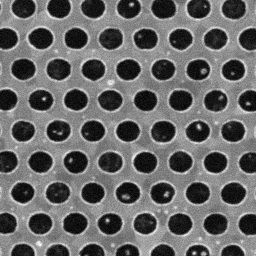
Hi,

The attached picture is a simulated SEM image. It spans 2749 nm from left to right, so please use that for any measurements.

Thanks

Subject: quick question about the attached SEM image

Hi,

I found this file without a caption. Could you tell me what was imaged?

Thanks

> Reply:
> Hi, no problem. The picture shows a regular array of holes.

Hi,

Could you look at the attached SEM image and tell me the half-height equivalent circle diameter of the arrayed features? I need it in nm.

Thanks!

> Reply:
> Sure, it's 256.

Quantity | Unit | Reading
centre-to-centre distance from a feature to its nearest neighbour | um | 0.374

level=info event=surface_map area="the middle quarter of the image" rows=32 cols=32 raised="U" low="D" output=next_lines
DDUUDDDDDDUUUDDDDDDUUUDDDDDDUUUD
DDUUDDDDDDUUUDDDDDDUUUDDDDDDUUDD
DDUUDDDDDDUUUDDDDDDUUUDDDDDDUUUD
DUUUUDDDDUUUUUDDDDUUUUUDDDDUUUUD
UUUUUUUUUUUUUUUUUUUUUUUUUUUUUUUU
UUUUUUUUUUUUUUUUUUUUUUUUUUUUUUUU
UUDDUUUUUUDDDUUUUUUDDUUUUUUUDDUU
DDDDDDUUUDDDDDUUUUDDDDDUUUUDDDDD
DDDDDDUUDDDDDDDUUDDDDDDDUUDDDDDD
DDDDDDUUDDDDDDDUUDDDDDDDUUDDDDDD
DDDDDDUUUDDDDDUUUUDDDDDUUUDDDDDD
UUDDDUUUUUDDDUUUUUUDDDUUUUUUDDDU
UUUUUUUUUUUUUUUUUUUUUUUUUUUUUUUU
UUUUUUUUUUUUUUUUUUUUUUUUUUUUUUUU
DUUUUDDDDUUUUUDDDDUUUUUDDDDUUUUU
DDUUDDDDDDUUUDDDDDDUUUDDDDDDUUUD
DDUUDDDDDDUUUDDDDDDUUUDDDDDDUUDD
DDUUDDDDDDUUUDDDDDDUUUDDDDDDUUDD
DUUUUDDDDDUUUUDDDDUUUUDDDDDDUUUD
UUUUUUUDUUUUUUUDDUUUUUUDDDUUUUUU
UUUUUUUUUUUUUUUUUUUUUUUUUUUUUUUU
UUUUUUUUUUUUUUUUUUUUUUUUUUUUUUUU
UDDDDUUUUUDDDDUUUUDDDDUUUUUDDDDU
DDDDDDUUUDDDDDDUUDDDDDDUUUDDDDDD
DDDDDDUUDDDDDDDUUDDDDDDUUUDDDDDD
DDDDDDUUUDDDDDDUUDDDDDDUUUDDDDDD
UDDDDUUUUDDDDDUUUUDDDDDUUUUDDDDU
UUUUUUUUUUUDUUUUUUUUDUUUUUUUUUUU
UUUUUUUUUUUUUUUUUUUUUUUUUUUUUUUU
UUUUUUUUUUUUUUUDDUUUUUUUDDUUUUUU
DUUUUDDDDDUUUUDDDDDUUUDDDDDUUUUD
DDUUDDDDDDUUUDDDDDDUUDDDDDDDUUDD